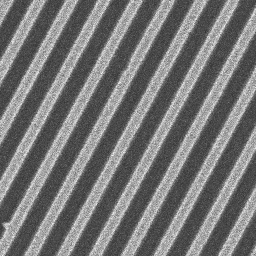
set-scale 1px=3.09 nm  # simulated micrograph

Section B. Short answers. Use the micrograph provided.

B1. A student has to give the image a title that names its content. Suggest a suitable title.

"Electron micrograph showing parallel lines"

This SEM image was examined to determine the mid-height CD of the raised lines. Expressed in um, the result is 0.0408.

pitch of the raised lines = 0.0878 microns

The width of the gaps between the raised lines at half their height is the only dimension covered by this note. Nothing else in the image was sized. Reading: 46.2 nm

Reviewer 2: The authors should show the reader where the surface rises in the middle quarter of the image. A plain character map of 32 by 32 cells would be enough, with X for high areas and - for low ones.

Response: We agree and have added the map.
XXX----XXXX-----XXX-----XXX-----
XX-----XXX-----XXX-----XXXX----X
XX----XXXX----XXXX-----XXX-----X
X-----XXX-----XXX-----XXXX----XX
X----XXXX----XXXX----XXXX----XXX
-----XXX-----XXX-----XXXX----XXX
----XXXX----XXXX----XXXX----XXXX
----XXX-----XXX-----XXX-----XXXX
---XXXX----XXXX----XXXX----XXXX-
---XXX-----XXX-----XXX-----XXX--
--XXXX----XXXX----XXXX----XXXX--
-XXXX-----XXX-----XXX-----XXX---
-XXXX----XXXX----XXXX----XXXX---
XXXX----XXXX-----XXX-----XXX----
XXX-----XXX-----XXXX----XXXX----
XXX----XXXX-----XXX-----XXX-----
XX-----XXX-----XXXX----XXXX----X
XX----XXXX----XXXX----XXXX----XX
X-----XXX-----XXXX----XXXX----XX
X----XXXX----XXXX----XXXX----XXX
-----XXX-----XXX-----XXX-----XXX
----XXXX----XXXX----XXXX----XXXX
----XXX-----XXX-----XXX-----XXX-
---XXXX----XXXX----XXXX----XXXX-
--XXXX-----XXX-----XXX-----XXX--
--XXX-----XXXX----XXXX----XXXX--
-XXXX-----XXX-----XXX-----XXX---
-XXX-----XXXX----XXXX----XXXX---
XXXX----XXXX----XXXX----XXXX----
XXX-----XXXX----XXXX----XXXX----
XXX----XXXX----XXXX----XXXX-----
XX-----XXXX----XXXX----XXXX----X